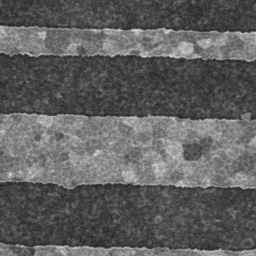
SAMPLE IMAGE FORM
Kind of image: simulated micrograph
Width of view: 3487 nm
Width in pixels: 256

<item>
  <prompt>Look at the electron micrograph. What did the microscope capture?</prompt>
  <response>one or a few lines or trenches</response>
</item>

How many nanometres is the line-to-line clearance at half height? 849